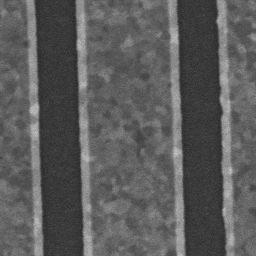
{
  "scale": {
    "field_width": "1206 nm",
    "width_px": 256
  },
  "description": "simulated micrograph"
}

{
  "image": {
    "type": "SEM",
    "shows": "one or a few lines or trenches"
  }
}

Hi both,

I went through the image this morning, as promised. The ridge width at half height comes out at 0.44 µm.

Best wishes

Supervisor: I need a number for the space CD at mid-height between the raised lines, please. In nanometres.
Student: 229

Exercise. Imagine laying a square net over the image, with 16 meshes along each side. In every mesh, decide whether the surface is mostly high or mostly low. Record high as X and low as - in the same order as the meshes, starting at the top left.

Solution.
XX---XXXXXX---XX
XX---XXXXXX---XX
XX---XXXXXX---XX
XX---XXXXXX---XX
XX---XXXXXX---XX
XX---XXXXXX---XX
XX---XXXXXX---XX
XX---XXXXXX---XX
XX---XXXXXX---XX
XX---XXXXXX---XX
XX---XXXXXX---XX
XX---XXXXXX---XX
XX---XXXXXX---XX
XX---XXXXXX---XX
XX---XXXXXX---XX
XX---XXXXXX---XX